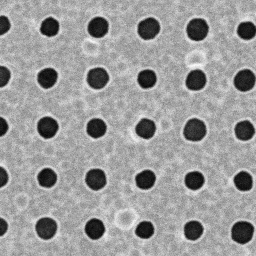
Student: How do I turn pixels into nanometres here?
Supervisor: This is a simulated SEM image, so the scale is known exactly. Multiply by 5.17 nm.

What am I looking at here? a regular array of holes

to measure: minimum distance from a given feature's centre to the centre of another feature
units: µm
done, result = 0.252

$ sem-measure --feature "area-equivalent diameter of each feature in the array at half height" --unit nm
111